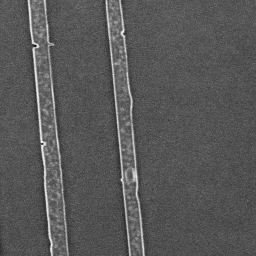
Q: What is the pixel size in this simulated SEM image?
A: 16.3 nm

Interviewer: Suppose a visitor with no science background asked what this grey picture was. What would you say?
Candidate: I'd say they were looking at one or a few lines or trenches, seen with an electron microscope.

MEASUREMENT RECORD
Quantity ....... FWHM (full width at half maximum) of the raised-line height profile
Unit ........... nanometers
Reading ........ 243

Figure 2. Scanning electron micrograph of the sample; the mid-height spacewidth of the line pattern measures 988 nanometers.